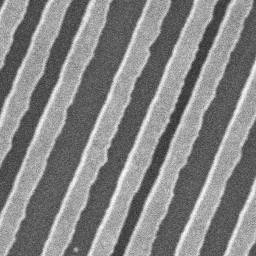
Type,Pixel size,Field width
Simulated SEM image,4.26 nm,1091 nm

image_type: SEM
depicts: lines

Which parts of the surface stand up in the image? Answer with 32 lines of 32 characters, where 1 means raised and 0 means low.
11100011100111000011100011100110
11100111000110000011100011101110
11100111001110000111000111001110
11000110001110000111000111001100
11001110011100000111000110011100
10001110011100001110001110011000
10001100011100001110001110111000
10011100111000011100011100111000
00011100111000011100011101110000
00111000110000111000111001110001
00110001110000111000111001100001
01110001100000110000111011100011
01110011100001110001110011000011
11110011000001110001110111000011
11100111000011100011100110000111
11000111000011100011101110000111
11001110000011000011001110001110
10001110000111000111001100001110
10001110000111000110011100001100
10011100001110001110011100011100
00011100001110001110111000011100
00111000001100011100110000111000
00111000011100011100110000110000
00110000011000011001110000110000
01110000111000111001110001110001
01100000111000110011100001100001
11100001110001110011100011100011
11100001110001110111000011000011
11000001100011100111000111000111
11000011100011100110000111000111
11000011100011001110001110000111
10000111000111001110001110001110